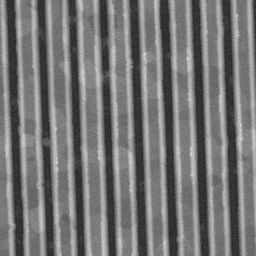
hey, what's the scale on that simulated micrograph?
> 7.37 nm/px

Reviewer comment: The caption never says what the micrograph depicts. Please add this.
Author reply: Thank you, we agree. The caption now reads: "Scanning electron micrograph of parallel lines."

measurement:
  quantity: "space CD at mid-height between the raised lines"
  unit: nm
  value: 118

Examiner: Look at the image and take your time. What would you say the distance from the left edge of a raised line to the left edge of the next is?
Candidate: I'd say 0.227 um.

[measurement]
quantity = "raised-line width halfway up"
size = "110 nm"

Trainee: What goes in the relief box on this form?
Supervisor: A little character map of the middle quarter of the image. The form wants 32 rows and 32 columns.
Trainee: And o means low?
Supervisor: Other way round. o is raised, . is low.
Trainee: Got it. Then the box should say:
....oooo....oooo....oooo....ooo.
o....ooo....oooo....oooo....ooo.
o....ooo....oooo....oooo....ooo.
o....ooo....oooo....oooo....ooo.
o....ooo....oooo....oooo....ooo.
o....ooo....oooo....oooo....oooo
o....ooo....oooo....oooo....oooo
o....oooo....ooo....oooo....oooo
o....oooo....ooo....oooo....oooo
o....oooo....ooo....oooo....oooo
o....oooo....ooo....oooo....oooo
o....oooo....ooo....oooo....oooo
o....oooo....ooo....oooo....oooo
o....oooo....ooo.....ooo....oooo
o....oooo....ooo.....ooo....oooo
o....oooo....ooo.....ooo....oooo
o....oooo....ooo.....ooo....oooo
o....oooo....ooo.....ooo....oooo
o....oooo....ooo.....ooo....oooo
o....oooo....ooo.....ooo....oooo
o....oooo....oooo....ooo.....ooo
o....oooo....oooo....ooo.....ooo
o....oooo....oooo....ooo.....ooo
o....oooo....oooo....ooo.....ooo
o....oooo....oooo....ooo.....ooo
o....oooo....oooo....ooo.....ooo
o....oooo....oooo....oooo....ooo
o....oooo....oooo....oooo....ooo
oo....oooo....ooo....oooo....ooo
oo....oooo....ooo....oooo....ooo
oo....ooo.....ooo....oooo....ooo
oo....ooo.....ooo....oooo....ooo